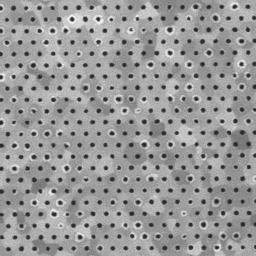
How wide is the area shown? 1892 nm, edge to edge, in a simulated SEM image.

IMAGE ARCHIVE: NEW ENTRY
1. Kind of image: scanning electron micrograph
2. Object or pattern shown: a regular array of holes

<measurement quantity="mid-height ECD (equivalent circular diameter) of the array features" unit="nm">34.4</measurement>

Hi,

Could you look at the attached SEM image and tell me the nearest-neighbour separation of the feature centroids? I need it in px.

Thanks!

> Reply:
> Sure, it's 12.7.